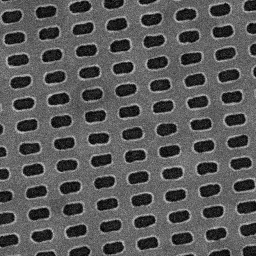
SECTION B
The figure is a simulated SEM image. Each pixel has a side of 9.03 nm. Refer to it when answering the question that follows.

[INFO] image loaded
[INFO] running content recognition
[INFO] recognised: a regular array of holes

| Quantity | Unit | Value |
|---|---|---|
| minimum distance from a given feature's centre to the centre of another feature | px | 22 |